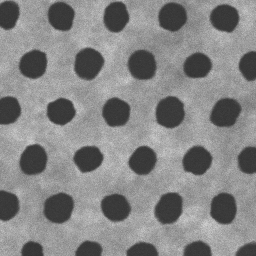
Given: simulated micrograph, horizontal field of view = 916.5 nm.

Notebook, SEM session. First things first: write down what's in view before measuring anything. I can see a regular array of holes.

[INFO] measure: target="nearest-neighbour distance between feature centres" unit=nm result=194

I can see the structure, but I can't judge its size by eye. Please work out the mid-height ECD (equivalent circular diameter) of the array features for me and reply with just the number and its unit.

100 nm